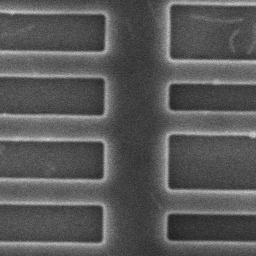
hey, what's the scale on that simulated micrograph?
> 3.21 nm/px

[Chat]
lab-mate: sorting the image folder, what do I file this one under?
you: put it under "groups of lines, slits or small figures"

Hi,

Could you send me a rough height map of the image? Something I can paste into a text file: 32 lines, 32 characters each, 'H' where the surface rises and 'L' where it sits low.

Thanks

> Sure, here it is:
HHHHHHHHHHHHHHHHHHHHHHLLLLHHHHHH
HHHHHHHHHHHHHHHHHHHHHLLLLLLLLLLL
LLLLLLLLLLLLLHHHHHHHHLLLLLLLLLLL
LLLLLLLLLLLLLHHHHHHHHLLLLLLLLLLL
LLLLLLLLLLLLLHHHHHHHHLLLLLLLLLLL
LLLLLLLLLLLLLHHHHHHHHLLLLLLLLLLL
LLLLLLLLLLLLLHHHHHHHHLLLLLLLLLLL
HHHHHHHHHHHHHHHHHHHHHHLLLLLLLLLL
HHHHHHHHHHHHHHHHHHHHHHHHHHHHHHHH
HHHHHHHHHHHHHHHHHHHHHHHHHHHHHHHH
LLLLLLLLLLLLLHHHHHHHHHLLLLHHLLLL
LLLLLLLLLLLLLHHHHHHHHLLLLLLLLLLL
LLLLLLLLLLLLLHHHHHHHHLLLLLLLLLLL
LLLLLLLLLLLLLHHHHHHHHLLLLLLLLLLL
HHHHHHHHHHLLHHHHHHHHHHHHHHHHHHHH
HHHHHHHHHHHHHHHHHHHHHHHHHHHHHHHH
HHHHHHHHHHHHHHHHHHHHHHHHHHHHHHHH
LLHLLLLLLLLHHHHHHHHHHLLLLLLLLLLL
LLLLLLLLLLLLLHHHHHHHHLLLLLLLLLLL
LLLLLLLLLLLLLHHHHHHHHLLLLLLLLLLL
LLLLLLLLLLLLLHHHHHHHHLLLLLLLLLLL
LLLLLLLLLLLLLHHHHHHHHLLLLLLLLLLL
HHHHHHHLLLLLHHHHHHHHHLLLLLLLLLLL
HHHHHHHHHHHHHHHHHHHHHLLLLLLLLLLL
HHHHHHHHHHHHHHHHHHHHHHHHHHHHHHHH
LLLLLLLLLLLHHHHHHHHHHHHHHHHHHHHH
LLLLLLLLLLLLLHHHHHHHHHHHHHHHHHHH
LLLLLLLLLLLLLHHHHHHHHLLLLLLLLLLL
LLLLLLLLLLLLLHHHHHHHHLLLLLLLLLLL
LLLLLLLLLLLLLHHHHHHHHLLLLLLLLLLL
HHHHHHHHHHHLHHHHHHHHHHHHHHHHHHHH
HHHHHHHHHHHHHHHHHHHHHHHHHHHHHHHH